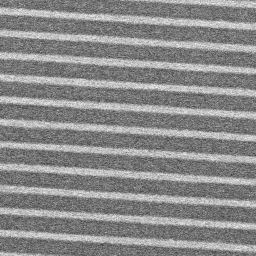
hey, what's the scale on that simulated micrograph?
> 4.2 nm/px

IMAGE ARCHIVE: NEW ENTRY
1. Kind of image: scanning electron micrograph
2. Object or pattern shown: parallel lines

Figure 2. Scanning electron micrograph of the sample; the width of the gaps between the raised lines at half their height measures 73.4 nm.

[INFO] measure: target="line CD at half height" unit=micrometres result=0.0199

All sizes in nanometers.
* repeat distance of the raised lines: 93.1